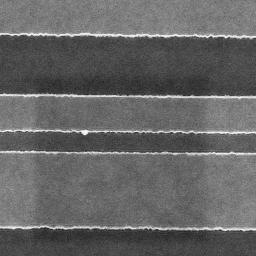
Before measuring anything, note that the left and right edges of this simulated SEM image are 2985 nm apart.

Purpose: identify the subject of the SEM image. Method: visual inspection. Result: lines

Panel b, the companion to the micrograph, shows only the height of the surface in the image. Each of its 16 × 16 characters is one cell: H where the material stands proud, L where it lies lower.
HHHHHHHHHHHHHHHH
HHHHHHHHHHHHHHHH
LLLLLLLLLLLLLLLL
LLLLLLLLLLLLLLLL
LLLLLLLLLLLLLLLL
LLLLLLLLLLLLLLLL
HHHHHHHHHHHHHHHH
HHHHHHHHHHHHHHHH
HHHHHHHHHHHHHHHH
HHHHHHHHHHHHHHHH
HHHHHHHHHHHHHHHH
HHHHHHHHHHHHHHHH
HHHHHHHHHHHHHHHH
HHHHHHHHHHHHHHHH
LLLLLLLLLLLLLLLL
LLLLLLLLLLLLLLLL